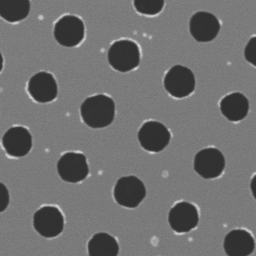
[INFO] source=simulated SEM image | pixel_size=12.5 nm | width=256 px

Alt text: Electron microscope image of a regular array of holes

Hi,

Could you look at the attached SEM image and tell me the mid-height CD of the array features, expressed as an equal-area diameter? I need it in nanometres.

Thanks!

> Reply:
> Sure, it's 387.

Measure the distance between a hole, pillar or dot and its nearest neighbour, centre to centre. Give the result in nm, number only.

749